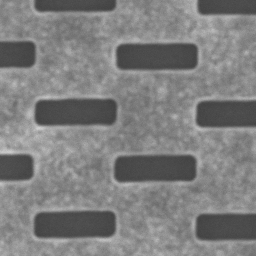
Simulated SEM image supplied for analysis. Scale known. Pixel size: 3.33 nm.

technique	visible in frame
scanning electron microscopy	holes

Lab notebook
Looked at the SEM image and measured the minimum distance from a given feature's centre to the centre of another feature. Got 324 nanometers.